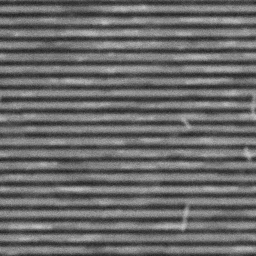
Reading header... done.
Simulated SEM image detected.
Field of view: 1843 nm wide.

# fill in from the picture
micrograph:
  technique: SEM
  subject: parallel lines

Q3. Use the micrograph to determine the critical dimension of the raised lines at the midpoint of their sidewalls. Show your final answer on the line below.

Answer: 0.0369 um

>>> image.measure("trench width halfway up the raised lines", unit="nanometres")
48.6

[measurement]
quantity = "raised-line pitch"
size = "0.087 micrometres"